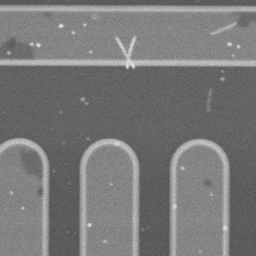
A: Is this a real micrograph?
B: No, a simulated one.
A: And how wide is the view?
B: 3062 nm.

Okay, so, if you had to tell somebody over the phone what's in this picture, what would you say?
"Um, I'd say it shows groups of lines, slits or small figures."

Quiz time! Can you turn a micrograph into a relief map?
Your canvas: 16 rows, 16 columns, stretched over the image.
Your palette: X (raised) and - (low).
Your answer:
XXXXXXXXXX------
XXXXXXXXXXXXXXXX
XXXXXXXXXXXXXXXX
XXXXXXXXXXXXXXXX
----------------
----------------
----------------
----------------
----------------
XXX---XX---XXX--
XXX--XXXX--XXX--
XXX--XXXX--XXX--
XXX--XXXX--XXX--
XXX--XXXX--XXX--
XXX--XXX---XXX--
XXX--XXX---XXX--